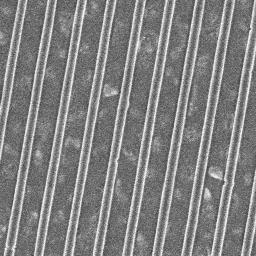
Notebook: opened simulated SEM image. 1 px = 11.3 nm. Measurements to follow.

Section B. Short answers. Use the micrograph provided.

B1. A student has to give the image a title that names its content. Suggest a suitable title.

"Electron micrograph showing parallel lines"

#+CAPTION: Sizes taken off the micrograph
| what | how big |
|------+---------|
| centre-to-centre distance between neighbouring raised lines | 330 nanometers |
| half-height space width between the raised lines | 223 nm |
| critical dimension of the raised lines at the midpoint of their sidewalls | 100 nm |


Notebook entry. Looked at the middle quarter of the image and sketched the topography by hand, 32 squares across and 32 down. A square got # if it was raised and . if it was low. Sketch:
.##.....##.....##......##.....##
.##.....##.....##......##.....##
##......##.....##.....###.....##
##......##.....##.....##......##
##.....###.....##.....##.....###
##.....##.....###.....##.....###
##.....##.##..###.....##.....##.
##.....##.###.##......##.....##.
#......##.....##.....###.....##.
#......##.....##.....##......##.
#.....##......##.....##......##.
#.....##.....###.....##.....###.
#.....##.....##......##.....##..
......##.....##......##.....##..
......##.....##.....###.....##..
......##.....##.....##.....###..
.....##......##.....##.....###..
.....##.....###.....##.....###..
.....##.....##......##.....##...
.....##.....##......##.....##...
.....##.....##.....###.....##...
....###.....##.....##.....###...
....##......##.....##.....###...
....##.....##......##.....###...
....##.....##......##.....##....
....##.....##......##.....##....
....##.....##.....##......##....
...###.....##.....##.....###....
...##......##.....##.....###....
...##.....##......##.....##.....
...##.....##......##.....##.....
...##.....##......##.....##.....